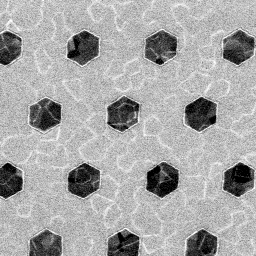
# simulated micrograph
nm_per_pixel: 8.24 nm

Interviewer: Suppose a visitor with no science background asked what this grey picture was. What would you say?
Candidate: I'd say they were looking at a regular array of raised bodies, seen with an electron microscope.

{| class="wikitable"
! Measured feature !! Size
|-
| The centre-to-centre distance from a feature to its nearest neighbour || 630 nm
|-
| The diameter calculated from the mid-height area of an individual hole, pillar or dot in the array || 281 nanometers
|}